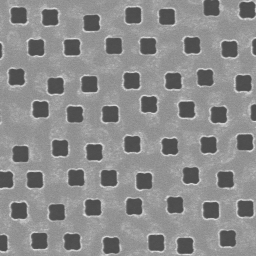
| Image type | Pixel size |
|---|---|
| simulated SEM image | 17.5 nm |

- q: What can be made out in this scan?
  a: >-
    a regular array of holes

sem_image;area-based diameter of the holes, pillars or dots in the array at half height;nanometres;314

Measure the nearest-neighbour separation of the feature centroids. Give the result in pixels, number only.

32.7